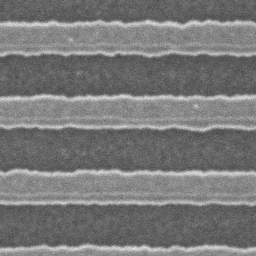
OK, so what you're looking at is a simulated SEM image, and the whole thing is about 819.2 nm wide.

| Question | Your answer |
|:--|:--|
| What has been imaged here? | lines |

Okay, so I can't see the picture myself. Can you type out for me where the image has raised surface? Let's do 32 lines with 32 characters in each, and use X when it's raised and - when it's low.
--------------------------------
--------------------------------
--------------------------------
XXXXXXXXXXXXXXXXXXXXXXXXXXXXXXXX
XXXXXXXXXXXXXXXXXXXXXXXXXXXXXXXX
XXXXXXXXXXXXXXXXXXXXXXXXXXXXXXXX
XXXXXXXXXXXXXXXXXXXXXXXXXXXXXXXX
--------------------------------
--------------------------------
--------------------------------
--------------------------------
--------------------------------
XXXXXXXXXXXXXXXXXXXXXXXXXXXXXXXX
XXXXXXXXXXXXXXXXXXXXXXXXXXXXXXXX
XXXXXXXXXXXXXXXXXXXXXXXXXXXXXXXX
XXXXXXXXXXXXXXXXXXXXXXXXXXXXXXXX
--------------------------------
--------------------------------
--------------------------------
--------------------------------
--------------------------------
-XXX------XXX-------------------
XXXXXXXXXXXXXXXXXXXXXXXXXXXXXXXX
XXXXXXXXXXXXXXXXXXXXXXXXXXXXXXXX
XXXXXXXXXXXXXXXXXXXXXXXXXXXXXXXX
-XX-XX-X----X----XXXX---XX--XXXX
--------------------------------
--------------------------------
--------------------------------
--------------------------------
--------------------------------
XXXXXXXXXXXXXXXXXXXXXXXXXXXXXXXX